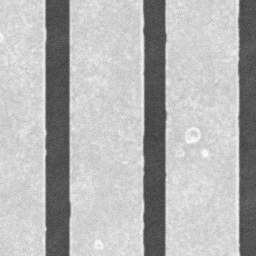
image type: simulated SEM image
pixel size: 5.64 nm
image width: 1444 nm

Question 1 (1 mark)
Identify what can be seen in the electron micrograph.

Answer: lines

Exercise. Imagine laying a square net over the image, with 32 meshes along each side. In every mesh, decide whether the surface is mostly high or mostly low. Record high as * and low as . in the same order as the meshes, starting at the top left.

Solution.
******...*********...*********..
******...*********...*********..
******...*********...*********..
******...*********...*********..
******...*********...*********..
******...*********...*********..
******...*********...*********..
******...*********...*********..
******...*********...*********..
******...*********...*********..
******...*********...*********..
******...*********...*********..
******...*********...*********..
******...*********...*********..
******...*********...*********..
******...*********...*********..
******...*********...*********..
******...*********...*********..
******...*********...*********..
******...*********...*********..
******...*********...*********..
******...*********...*********..
******...*********...*********..
******...*********...*********..
******...*********...*********..
******...*********...*********..
******...*********...*********..
******...*********...*********..
******...*********...*********..
******...*********...*********..
******...*********...*********..
******...*********...*********..